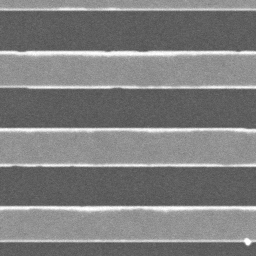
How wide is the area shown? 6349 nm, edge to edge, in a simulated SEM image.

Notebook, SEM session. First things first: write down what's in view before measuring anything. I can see lines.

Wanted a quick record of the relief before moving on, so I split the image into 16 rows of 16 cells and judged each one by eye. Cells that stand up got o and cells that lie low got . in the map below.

oooooooooooooooo
................
................
oooooooooooooooo
oooooooooooooooo
................
................
................
oooooooooooooooo
oooooooooooooooo
................
................
................
oooooooooooooooo
oooooooooooooooo
................